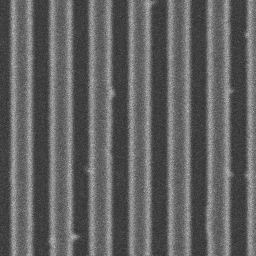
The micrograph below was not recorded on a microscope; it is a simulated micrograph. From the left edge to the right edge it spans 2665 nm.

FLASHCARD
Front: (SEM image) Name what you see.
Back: parallel lines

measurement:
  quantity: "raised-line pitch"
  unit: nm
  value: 409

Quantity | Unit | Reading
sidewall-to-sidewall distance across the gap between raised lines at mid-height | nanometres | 214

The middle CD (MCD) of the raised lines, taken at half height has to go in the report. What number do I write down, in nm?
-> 194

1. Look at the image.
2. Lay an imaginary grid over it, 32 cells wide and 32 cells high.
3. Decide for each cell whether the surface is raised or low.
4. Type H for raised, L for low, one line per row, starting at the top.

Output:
LLHHLLHHHLLHHHLLHHHLLHHHLLHHLLLH
LLHHLLHHHLLHHHLLHHHLLHHHLLHHLLLH
LLHHLLHHHLLHHHLLHHHLLHHHLLHHLLLH
LLHHLLHHHLLHHHLLHHHLLHHHLLHHLLLH
LLHHLLHHHLLHHHLLHHHLLHHHLLHHLLLH
LLHHLLHHHLLHHHLLHHHLLHHHLLHHLLLH
LLHHLLHHHLLHHHLLHHHLLHHLLLHHLLLH
LLHHLLHHHLLHHHLLHHHLLHHHLLHHLLLH
LLHHLLHHHLLHHHLLHHHLLHHHLLHHLLLH
LLHHLLHHHLLHHHLLHHHLLHHHLLHHLLLH
LLHHLLHHHLLHHHLLHHHLLHHHLLHHLLLH
LLHHLLHHHLLHHHLLHHHLLHHHLLHHHLLH
LLHHLLHHHLLHHHLLHHHLLHHHLLHHLLLH
LLHHLLHHHLLHHHLLHHHLLHHLLLHHLLLH
LLHHLLHHHLLHHHLLHHHLLHHLLLHHLLLH
LLHHLLHHHLLHHHLLHHHLLHHHLLHHLLLH
LLHHLLHHHLLHHHLLHHHLLHHHLLHHLLLH
LLHHLLHHHLLHHHLLHHHLLHHHLLHHLLLH
LLHHLLHHHLLHHHLLHHHLLHHHLLHHLLLH
LLHHLLHHHLLHHHLLHHHLLHHHLLHHHLLH
LLHHLLHHHLLHHHLLHHHLLHHHLLHHHLLH
LLHHLLHHHLLHHHLLHHHLLHHHLLHHHLLH
LLHHLLHHHLLHHHLLHHHLLHHHLLHHLLLH
LLHHLLHHHLLHHHLLHHHLLHHHLLHHLLLH
LLHHLLHHHLLHHHLLHHHLLHHHLLHHLLLH
LLHHLLHHHLLHHHLLHHHLLHHHLLHHLLLH
LLHHLLHHHLLHHHLLHHHLLHHHLLHHLLLH
LLHHLLHHHLLHHHLLHHHLLHHHLLHHLLLH
LLHHLLHHHLLHHHLLHHHLLHHHLLHHLLLH
LLHHLLHHHLLHHHLLHHHLLHHHLLHHLLLH
LLHHLLHHHLLHHHLLHHHLLHHHLLHHLLLH
LLHHLLHHHLLHHHLLHHHLLHHHLLHHLLLH